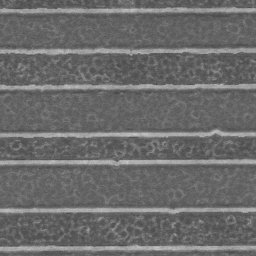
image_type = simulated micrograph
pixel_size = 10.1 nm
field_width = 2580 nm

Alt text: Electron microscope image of one or a few lines or trenches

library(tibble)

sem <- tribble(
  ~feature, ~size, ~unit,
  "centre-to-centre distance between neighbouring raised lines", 0.808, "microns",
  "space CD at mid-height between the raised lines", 0.479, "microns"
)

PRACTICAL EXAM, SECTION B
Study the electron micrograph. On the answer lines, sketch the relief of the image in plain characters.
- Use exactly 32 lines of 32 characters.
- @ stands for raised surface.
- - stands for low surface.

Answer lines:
@@@@@@@@@@@@@@@@@@@@@@@@@@@@@@@@
--------------------------------
--------------------------------
--------------------------------
--------------------------------
--------------------------------
@@-----@@@@@@@@@@@@@@@@@@@@@@@@@
@@@@@@@@@@@@@@@@@@@@@@@@@@@@@@@@
@@@@@@@@@@@@@@@@@@@@@@@@@@@@@@@@
@@@@@@@@@@@@@@@@@@@@@@@@@@@@@@@@
@@@@@@@@@@@@@@@@@@@@@@@@@@@@@@@@
--------------------------------
--------------------------------
--------------------------------
--------------------------------
--------------------------------
--------------------------------
@@@@@@@@@@@@@@@@@@@@@@@@@@@@@@@@
@@@@@@@@@@@@@@@@@@@@@@@@@@@@@@@@
@@@@@@@@@@@@@@@@@@@@@@@@@@@@@@@@
--------------------------------
--------------------------------
--------------------------------
--------------------------------
--------------------------------
--------------------------------
@@@@@@@@@@@@@@@@@@@@@@@@@@@@@@@@
@@@@@@@@@@@@@@@@@@@@@@@@@@@@@@@@
@@@@@@@@@@@@@@@@@@@@@@@@@@@@@@@@
@@@@@@@@@@@@@@@@@@@@@@@@@@@@@@@@
@@@@@@@@@@@@@@@@@@@@@@@@@@@@@@@@
--------------------------------